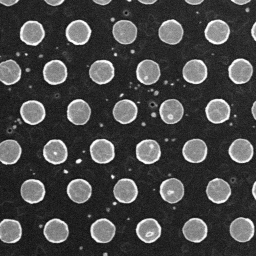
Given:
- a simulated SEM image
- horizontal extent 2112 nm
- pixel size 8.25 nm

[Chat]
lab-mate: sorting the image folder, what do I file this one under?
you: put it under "a regular array of raised bodies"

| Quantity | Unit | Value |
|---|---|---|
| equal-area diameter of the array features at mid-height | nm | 200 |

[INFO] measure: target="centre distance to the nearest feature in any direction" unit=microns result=0.376